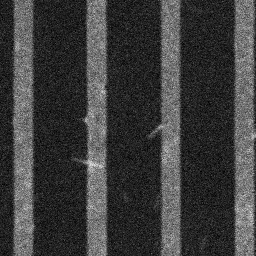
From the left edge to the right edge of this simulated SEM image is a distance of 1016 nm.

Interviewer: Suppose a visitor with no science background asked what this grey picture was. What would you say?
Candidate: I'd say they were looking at one or a few lines or trenches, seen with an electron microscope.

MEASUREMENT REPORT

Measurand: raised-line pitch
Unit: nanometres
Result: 293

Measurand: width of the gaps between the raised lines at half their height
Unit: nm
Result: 222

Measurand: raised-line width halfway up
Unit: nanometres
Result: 71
